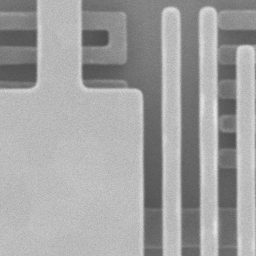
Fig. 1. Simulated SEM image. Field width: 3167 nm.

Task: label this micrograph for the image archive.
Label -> wiring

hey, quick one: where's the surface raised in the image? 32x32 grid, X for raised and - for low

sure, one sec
-----XXXXX----------------------
-----XXXXX----------XX---XX-----
-----XXXXX----------XX---XX-----
-----XXXXX----------XX---XX-----
-----XXXXX----------XX---XX-----
-----XXXXX----------XXX--XX-----
-----XXXXX----------XXX--XX---XX
-----XXXXX----------XXX--XX---XX
-----XXXXX----------XX---XX---XX
-----XXXXX----------XX---XX---XX
-----XXXXX----------XX---XX---XX
XXXXXXXXXXXXXXXXX---XXX--XX---XX
XXXXXXXXXXXXXXXXXX--XXX--XX---XX
XXXXXXXXXXXXXXXXXX--XXX--XX---XX
XXXXXXXXXXXXXXXXXX--XXX--XX---XX
XXXXXXXXXXXXXXXXXX--XXX--XX---XX
XXXXXXXXXXXXXXXXXX--XXX--XX---XX
XXXXXXXXXXXXXXXXXX--XXX--XX---XX
XXXXXXXXXXXXXXXXXX--XXX--XX---XX
XXXXXXXXXXXXXXXXXX--XXX--XX---XX
XXXXXXXXXXXXXXXXXX--XXX--XX---XX
XXXXXXXXXXXXXXXXXX--XXX--XX---XX
XXXXXXXXXXXXXXXXXX--XXX--XX---XX
XXXXXXXXXXXXXXXXXX--XXX--XX---XX
XXXXXXXXXXXXXXXXXX--XXX--XX---XX
XXXXXXXXXXXXXXXXXX--XXX--XX---XX
XXXXXXXXXXXXXXXXXX--XXX--XX---XX
XXXXXXXXXXXXXXXXXX--XXX--XX---XX
XXXXXXXXXXXXXXXXXX--XXX--XX---XX
XXXXXXXXXXXXXXXXXX--XXX--XX---XX
XXXXXXXXXXXXXXXXXX--XXX--XX---XX
XXXXXXXXXXXXXXXXXX--XXX--XX---XX